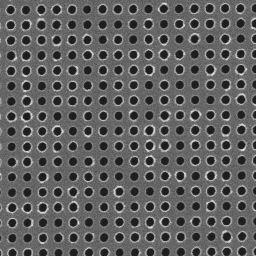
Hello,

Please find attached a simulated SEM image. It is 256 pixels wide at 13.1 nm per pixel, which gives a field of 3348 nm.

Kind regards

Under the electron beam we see a regular array of holes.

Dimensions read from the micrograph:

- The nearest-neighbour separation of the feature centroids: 194 nm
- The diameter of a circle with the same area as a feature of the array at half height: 0.107 microns